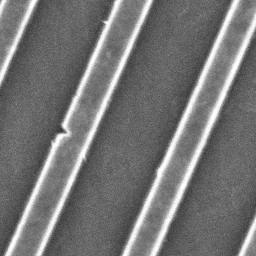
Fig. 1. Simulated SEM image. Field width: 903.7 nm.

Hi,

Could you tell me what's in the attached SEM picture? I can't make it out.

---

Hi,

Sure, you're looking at one or a few lines or trenches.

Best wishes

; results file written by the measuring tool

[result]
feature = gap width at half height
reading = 280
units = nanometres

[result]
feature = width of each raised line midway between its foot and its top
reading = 27.6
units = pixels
